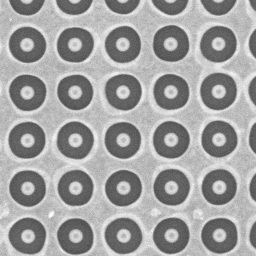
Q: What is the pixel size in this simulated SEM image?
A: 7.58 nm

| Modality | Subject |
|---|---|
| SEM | an array of small figures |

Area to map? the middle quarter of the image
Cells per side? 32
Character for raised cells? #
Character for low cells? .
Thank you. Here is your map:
################################
################################
##..##########..#########...####
......#####.......#####.......##
.......###.........###.........#
........#..........###.........#
..##....#.....##....##...###...#
..##...###...###....##...###....
.......###.........###.........#
.......###.........###.........#
......#####.......#####.......##
##..########.....#######.....###
################################
################################
#...#########...########....####
......#####.......#####.......##
.......###.........###.........#
........##.........###.........#
..##....##....##....##...###....
..##....##....##....##...###....
........##..........##.........#
.......####........###.........#
.......####.......#####.......##
......#######....#######.....###
################################
################################
.....#########..########......##
......######......#####........#
.......####........####........#
.......###.........###..........
..##....##....##....##....##....
..##....##....##....##....##....